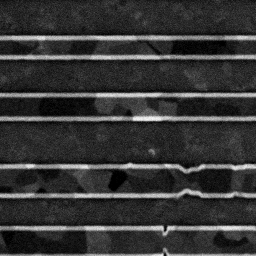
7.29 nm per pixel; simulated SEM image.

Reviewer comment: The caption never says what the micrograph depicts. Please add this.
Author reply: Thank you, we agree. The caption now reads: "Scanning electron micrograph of one or a few lines or trenches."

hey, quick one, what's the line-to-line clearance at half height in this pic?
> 274 nanometres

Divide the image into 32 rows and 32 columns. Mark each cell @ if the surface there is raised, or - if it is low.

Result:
--------------------------------
--------------------------------
--------------------------------
--------------------------------
--------------------------------
@@@@@@@@@@@@@@@@@@@@@@@@@@@@@@@@
@@@@@@@@@@@@@@@@@@@@@@@@@@@@@@@@
--------------------------------
--------------------------------
--------------------------------
--------------------------------
--------------------------------
@@@@@@@@@@@@@@@@@@@@@@@@@@@@@@@@
@@@@@@@@@@@@@@@@@@@@@@@@@@@@@@@@
@@@@@@@@@@@@@@@@@@@@@@@@@@@@@@@@
--------------------------------
--------------------------------
--------------------------------
--------------------------------
--------------------------------
--------------------------------
@@@@@@@@@@@@@@@@@@@@@@@@@@@@@@@@
@@@@@@@@@@@@@@@@@@@@@@@@@@@@@@@@
@@@@@@@@@@@@@@@@@@@@@@@@@@@@@@@@
--------------------------------
--------------------------------
--------------------------------
--------------------------------
--------------------------------
@@@@@@@@@@@@@@@@@@@@@@@@@@@@@@@@
@@@@@@@@@@@@@@@@@@@@@@@@@@@@@@@@
@@@@@@@@@@@@@@@@@@@@@@@@@@@@@@@@